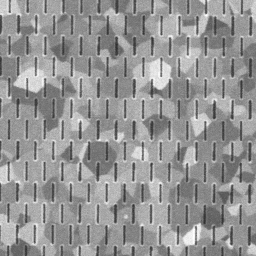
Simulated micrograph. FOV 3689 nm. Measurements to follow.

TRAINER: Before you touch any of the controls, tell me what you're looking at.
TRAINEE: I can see a regular array of holes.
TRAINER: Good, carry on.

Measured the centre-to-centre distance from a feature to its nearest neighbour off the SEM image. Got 0.256 µm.